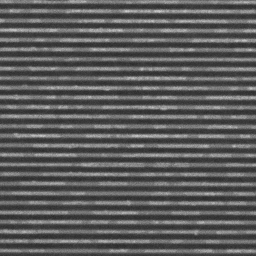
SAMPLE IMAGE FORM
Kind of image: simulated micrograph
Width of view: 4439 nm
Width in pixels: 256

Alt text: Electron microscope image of parallel lines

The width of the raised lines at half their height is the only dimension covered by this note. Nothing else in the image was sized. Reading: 62.9 nm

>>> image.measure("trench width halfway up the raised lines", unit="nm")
111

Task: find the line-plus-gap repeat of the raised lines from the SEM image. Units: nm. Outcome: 166